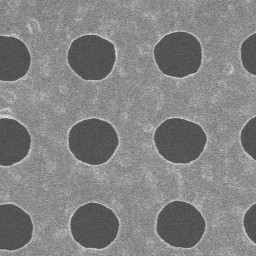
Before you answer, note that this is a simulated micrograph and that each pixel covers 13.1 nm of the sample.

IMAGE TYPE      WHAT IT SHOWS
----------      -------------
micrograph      holes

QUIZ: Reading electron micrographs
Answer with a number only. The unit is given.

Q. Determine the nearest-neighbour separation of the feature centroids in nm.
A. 1100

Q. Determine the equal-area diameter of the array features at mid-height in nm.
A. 624